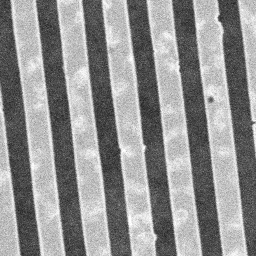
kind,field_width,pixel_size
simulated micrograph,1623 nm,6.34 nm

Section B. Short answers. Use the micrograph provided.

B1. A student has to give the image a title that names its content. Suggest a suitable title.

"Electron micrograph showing parallel lines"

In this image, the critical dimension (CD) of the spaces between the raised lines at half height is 134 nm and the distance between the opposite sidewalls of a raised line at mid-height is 150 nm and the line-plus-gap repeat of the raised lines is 286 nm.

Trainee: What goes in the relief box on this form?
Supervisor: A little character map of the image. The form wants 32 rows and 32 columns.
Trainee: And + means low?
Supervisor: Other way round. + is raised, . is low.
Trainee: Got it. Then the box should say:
.+++...+++...+++...++...+++...++
..+++..+++...+++...+++..+++...++
..+++..+++...+++...+++..+++...++
..+++...+++..+++...+++..++++..++
..+++...+++..+++...+++...+++..++
..+++...+++..+++...+++...+++..++
..+++...+++..++++..+++...+++...+
..+++...+++...+++..+++...+++...+
..+++...+++...+++..+++...+++...+
...++...+++...+++...+++..+++...+
...+++..+++...+++...+++..+++...+
...+++..+++...+++...+++..+++...+
...+++...++...+++...+++...+++..+
...+++...+++..+++...+++...+++..+
...+++...+++..++++..+++...+++...
+..+++...+++...+++..+++...+++...
+..+++...+++...+++..+++...+++...
+...++...+++...+++...++...+++...
+...+++..+++...+++...+++..+++...
+...+++..+++...+++...+++..+++...
+...+++..+++...+++...+++..++++..
+...+++...+++..+++...+++...+++..
+...+++...+++...++...+++...+++..
++..+++...+++...++...+++...+++..
++..+++...+++...+++..+++...+++..
++..+++...+++...+++..+++...+++..
++...++...+++...+++...+++..+++..
++...++...+++...+++...+++..+++..
++...+++..+++...+++...+++..+++..
++...+++..++++..+++...+++...+++.
++...+++...+++..+++...+++...+++.
++...+++...+++..+++...+++...+++.